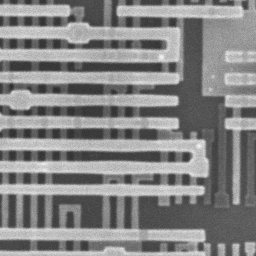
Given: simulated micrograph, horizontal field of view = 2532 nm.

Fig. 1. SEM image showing wiring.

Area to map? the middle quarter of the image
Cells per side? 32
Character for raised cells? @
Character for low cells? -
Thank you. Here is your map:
--------------------------------
--------------------------------
@@@@@@@@@@@@@@@@@@@@@@@@@@@@----
@@@@@@@@@@@@@@@@@@@@@@@@@@@@@---
@@@@@@@@@@@@@@@@@@@@@@@@@@@@@---
--------------------------------
--------------------------------
--------------------------------
@@@@@@@@@@@@@@@@@@@@@@@@@@@@----
@@@@@@@@@@@@@@@@@@@@@@@@@@@@----
-------------------@@-----------
--------------------------------
--------------------------------
@@@@@@@-------------------------
@@@@@@@@@@@@@@@@@@@@@@@@@@@@@---
@@@@@@@@@@@@@@@@@@@@@@@@@@@@@---
--------------------------------
--------------------------------
--------------------------------
@@@@@@@@@@@@@@@@@@@@@@@@@@@@@@@@
@@@@@@@@@@@@@@@@@@@@@@@@@@@@@@@@
--------@@@@@@@@@@@@@---@@@@@@@@
--------------------------------
--------------------------------
-------------------------------@
@@@@@@@@@@@@@@@@@@@@@@@@@@@@@@@@
@@@@@@@@@@@@@@@@@@@@@@@@@@@@@@@@
-------------------------------@
--------------------------------
--------------------------------
@@@@@@@@@@@@@@@@@@@@@@@@@@@@----
@@@@@@@@@@@@@@@@@@@@@@@@@@@@@@@@